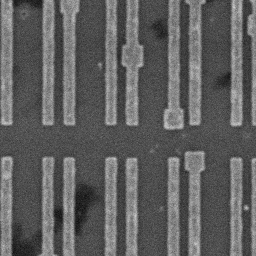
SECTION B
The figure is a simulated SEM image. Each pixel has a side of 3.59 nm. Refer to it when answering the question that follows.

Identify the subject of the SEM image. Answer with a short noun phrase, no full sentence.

wiring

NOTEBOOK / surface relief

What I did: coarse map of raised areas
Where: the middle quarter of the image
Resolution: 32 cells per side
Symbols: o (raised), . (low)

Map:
ooo........oo..oooo.......ooo...
ooo........oo...oo........ooo...
ooo........oo...oo........ooo...
ooo........oo...oo........ooo...
ooo........oo...oo........ooo...
ooo........oo...oo........ooo...
ooo........oo...oo........ooo...
ooo........oo...oo........ooo...
oo.........oo...oo........ooo...
oo.........oo...oo........ooo...
oo.........oo...oo........ooo...
oo.........oo...oo........ooo...
oo.........oo...oo.......o.ooo..
oo.........oo...oo.......o.ooo..
ooo........oo...oo.......o.ooo..
.........................oo.oo..
................................
................................
................................
................................
................................
................................
...............................o
...............................o
oo.........oo...oo........ooo..o
oo.........oo...oo........ooo..o
oo.........oo...oo........ooo..o
oo.........oo...oo........ooo...
oo.........oo...oo........ooo...
oo.........oo...oo........ooo...
oo.........oo...oo........ooo...
oo.........oo...oo........ooo...